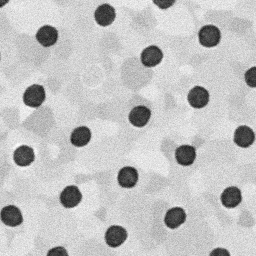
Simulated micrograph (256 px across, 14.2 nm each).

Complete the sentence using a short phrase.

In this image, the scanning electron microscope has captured a regular array of holes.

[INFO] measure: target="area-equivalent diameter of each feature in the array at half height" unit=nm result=322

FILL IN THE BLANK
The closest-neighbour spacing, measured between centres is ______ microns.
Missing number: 0.856